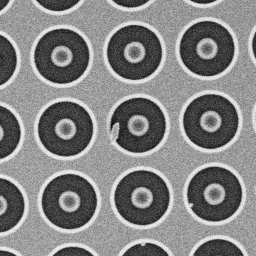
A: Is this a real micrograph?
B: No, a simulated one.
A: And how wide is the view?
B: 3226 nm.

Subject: an array of small figures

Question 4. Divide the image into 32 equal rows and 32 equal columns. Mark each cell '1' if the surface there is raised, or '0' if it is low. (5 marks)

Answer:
01111000001111000011111100111111
11111100111111111111111111111111
11111111111111111111111110011111
11111110011111100001111000001111
01111000001111000000111000000111
00110000000110000000110001100110
00110001100110001100110001100010
00110001100110001000111000000111
00110000000111000000111000000111
00111000001111100001111110011111
01111110011111111111111111111111
11111111111111111111111111111111
11111111111111110001111100000111
01111100000111000000111000000011
00111000000111000000011000100011
00011001100011001100011001100011
00011001100011100100011000000011
00011000000011000000111000000111
00111000000111100000111110001111
01111110001111111111111111111111
11111111111111111111111111111111
11111111011111110001111100000111
01111100000111100000011100000011
00011000000011000000011000110011
00011000110011000110011000110011
10011000110011000100011000000011
00011000000011100000011100000011
00011100000111100000111110001111
00111110001111111111111111111111
11111111111111111111111111111111
11111111111111111000111110000011
00111110000011100000011100000011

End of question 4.